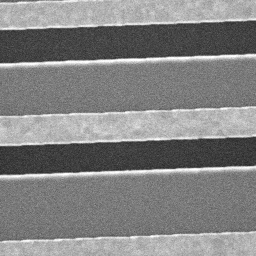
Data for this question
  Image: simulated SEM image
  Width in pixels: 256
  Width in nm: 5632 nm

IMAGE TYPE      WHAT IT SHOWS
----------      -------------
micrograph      lines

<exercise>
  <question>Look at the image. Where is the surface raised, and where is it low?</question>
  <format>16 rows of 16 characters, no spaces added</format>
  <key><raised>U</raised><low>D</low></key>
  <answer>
UUUUUUUUUUUUUUUU
UUUUUUUUUDDDDDDD
DDDDDDDDDDDDDDDD
DDDDDDDDDDDDDDUU
UUUUUUUUUUUUUUUU
UUUUUUUUUUUUUUUU
UUUUUUUUUUUUUUUU
UUUUUUUUUUUUUUUU
UUUUUUUUUUUUUUUD
DDDDDDDDDDDDDDDD
DDDDDDDDDDDDDUUU
UUUUUUUUUUUUUUUU
UUUUUUUUUUUUUUUU
UUUUUUUUUUUUUUUU
UUUUUUUUUUUUUUUU
UUUUUUUUUUUUUUUU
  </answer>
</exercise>